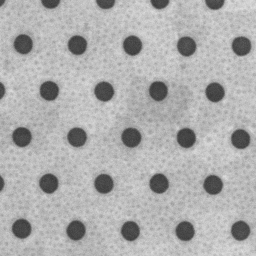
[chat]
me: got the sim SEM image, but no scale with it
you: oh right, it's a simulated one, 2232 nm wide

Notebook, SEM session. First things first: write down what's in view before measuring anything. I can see a regular array of holes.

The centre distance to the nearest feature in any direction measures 465 nm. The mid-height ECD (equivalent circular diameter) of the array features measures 0.179 µm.